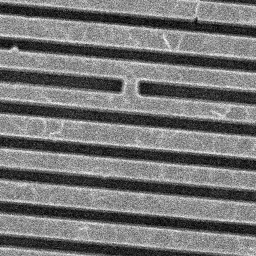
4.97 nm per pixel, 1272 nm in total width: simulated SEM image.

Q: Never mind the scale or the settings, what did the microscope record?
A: parallel lines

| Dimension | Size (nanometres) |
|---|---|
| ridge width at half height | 106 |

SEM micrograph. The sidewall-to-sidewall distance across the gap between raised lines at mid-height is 61.2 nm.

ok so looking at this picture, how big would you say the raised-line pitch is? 163 nanometres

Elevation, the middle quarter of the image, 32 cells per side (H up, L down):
HHHHHHHHHHHHHHHHHHHHHHHHHHHHHLLL
HHHHHHHHHHHHHHHHHHHHHHHHHHHHHHHH
LLHHHHHHHHHHHHHHHHHHHHHHHHHHHHHH
LLLLLLLLLLLLLHHHHHHHHHHHHHHHHHHH
LLLLLLLLLLLLLLLHHHHLLLLHHHHHHHHH
LLLLLLLLLLLLLLLHHHLLLLLLLLLLLLLL
HHHHHLLLLLLLLLLHHHHLLLLLLLLLLLLL
HHHHHHHHHHHHHHHHHHHLLLLLLLLLLLLL
HHHHHHHHHHHHHHHHHHHHHHHHHHLLLLLL
HHHHHHHHHHHHHHHHHHHHHHHHHHHHHHHH
HHHHHHHHHHHHHHHHHHHHHHHHHHHHHHHH
LLLLLLLLLLHHHHHHHHHHHHHHHHHHHHHH
LLLLLLLLLLLLLLLLLLLLLHHHHHHHHHHH
LLLLLLLLLLLLLLLLLLLLLLLLLLLLLLLL
HHHHHHHLLLLLLLLLLLLLLLLLLLLLLLLL
HHHHHHHHHHHHHHHHHHLLLLLLLLLLLLLL
HHHHHHHHHHHHHHHHHHHHHHHHHHHHHLLL
HHHHHHHHHHHHHHHHHHHHHHHHHHHHHHHH
HHHHHHHHHHHHHHHHHHHHHHHHHHHHHHHH
LLLHHHHHHHHHHHHHHHHHHHHHHHHHHHHH
LLLLLLLLLLLLLLHHHHHHHHHHHHHHHHHH
LLLLLLLLLLLLLLLLLLLLLLLLHHHHHHHH
LLLLLLLLLLLLLLLLLLLLLLLLLLLLLLLL
HHHHHHHHHHLLLLLLLLLLLLLLLLLLLLLL
HHHHHHHHHHHHHHHHHHHHHLLLLLLLLLLL
HHHHHHHHHHHHHHHHHHHHHHHHHHHHHHHH
HHHHHHHHHHHHHHHHHHHHHHHHHHHHHHHH
LLLHHHHHHHHHHHHHHHHHHHHHHHHHHHHH
LLLLLLLLLLLLLLLLHHHHHHHHHHHHHHHH
LLLLLLLLLLLLLLLLLLLLLLLLHHHHHHHH
LLLLLLLLLLLLLLLLLLLLLLLLLLLLLLLL
HHHHHHHHHHLLLLLLLLLLLLLLLLLLLLLL